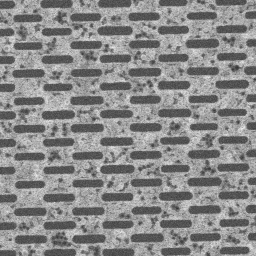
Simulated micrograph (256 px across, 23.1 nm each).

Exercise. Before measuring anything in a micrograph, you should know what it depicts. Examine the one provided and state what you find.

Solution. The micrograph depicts a regular array of holes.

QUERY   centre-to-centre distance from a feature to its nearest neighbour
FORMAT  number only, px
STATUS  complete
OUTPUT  27.6